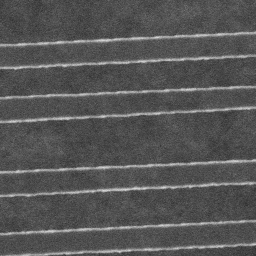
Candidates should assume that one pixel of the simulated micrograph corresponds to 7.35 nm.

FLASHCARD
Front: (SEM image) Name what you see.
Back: lines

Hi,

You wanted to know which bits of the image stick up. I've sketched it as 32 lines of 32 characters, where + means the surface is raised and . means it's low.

................................
................................
................................
................................
.....................+++++++++++
..++++++++++++++++++++++++++++++
++++++++++++++++++++++++++++++++
++++++++++++++++++++............
................................
................................
................................
..............++++++++++++++++++
++++++++++++++++++++++++++++++++
+++++++++++++++++++++++++++++++.
+++++++++++++...................
................................
................................
................................
................................
................................
.....................+++++++++++
++++++++++++++++++++++++++++++++
++++++++++++++++++++++++++++++++
+++++++++++++++++++.............
................................
................................
................................
................................
.............+++++++++++++++++++
++++++++++++++++++++++++++++++++
++++++++++++++++++++++++++++++++
+++++++++++.....................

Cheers